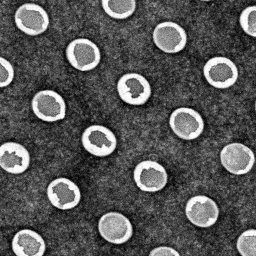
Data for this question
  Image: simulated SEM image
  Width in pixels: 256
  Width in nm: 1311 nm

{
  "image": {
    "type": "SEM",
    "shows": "a regular array of raised bodies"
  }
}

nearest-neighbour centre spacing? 315 nanometers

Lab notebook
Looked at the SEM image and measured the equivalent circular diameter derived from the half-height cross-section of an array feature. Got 0.161 um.